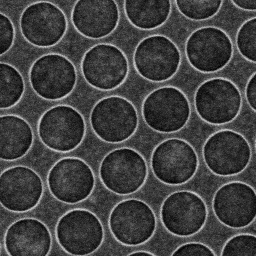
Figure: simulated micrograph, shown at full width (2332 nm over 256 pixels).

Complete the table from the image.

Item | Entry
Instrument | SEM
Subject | a regular array of holes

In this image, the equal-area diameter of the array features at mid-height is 413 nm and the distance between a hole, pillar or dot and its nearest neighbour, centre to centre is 0.478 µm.